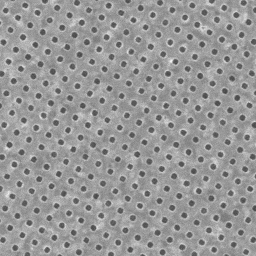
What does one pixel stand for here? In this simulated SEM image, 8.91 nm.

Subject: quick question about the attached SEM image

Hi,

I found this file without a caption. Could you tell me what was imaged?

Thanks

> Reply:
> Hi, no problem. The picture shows a regular array of holes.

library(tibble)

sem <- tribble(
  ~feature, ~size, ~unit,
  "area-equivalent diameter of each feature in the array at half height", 57.8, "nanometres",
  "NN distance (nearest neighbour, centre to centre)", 125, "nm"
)